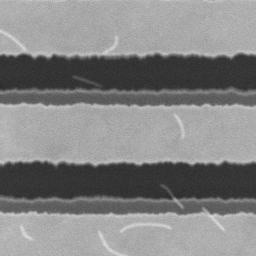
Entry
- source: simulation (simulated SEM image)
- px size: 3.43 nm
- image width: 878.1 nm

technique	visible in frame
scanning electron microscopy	lines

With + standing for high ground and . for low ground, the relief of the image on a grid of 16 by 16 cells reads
++++++++++++++++
++++++++++++++++
++++++++++++++++
..+.++.......+..
................
................
++++++++++++++++
++++++++++++++++
++++++++++++++++
++++++++++++++++
................
................
+.++++++++++++++
++++++++++++++++
++++++++++++++++
++++++++++++++++